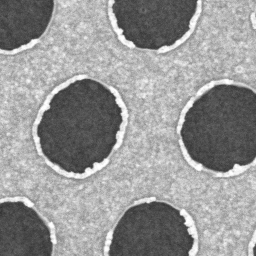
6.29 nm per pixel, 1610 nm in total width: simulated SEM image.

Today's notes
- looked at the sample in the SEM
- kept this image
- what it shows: holes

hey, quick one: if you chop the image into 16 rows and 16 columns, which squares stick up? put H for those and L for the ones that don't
LLLHHHHLLLLLHHHH
LLLHHHHLLLLLHHHH
LLHHHHHHLLLHHHHH
HHHHHHHHHHHHHHHH
HHHHHHHHHHHHHHHH
HHHHLLLHHHHHHLLH
HHHLLLLHHHHHLLLL
HHHLLLLLHHHLLLLL
HHLLLLLHHHHLLLLL
HHHLLLLHHHHHLLLL
HHHHLLHHHHHHHLLH
HHHHHHHHHHHHHHHH
HHHHHHHHHHHHHHHH
LLLHHHHHLLLHHHHH
LLLHHHHLLLLLHHHH
LLLHHHHLLLLLHHHH